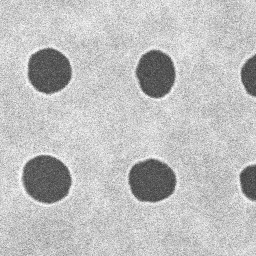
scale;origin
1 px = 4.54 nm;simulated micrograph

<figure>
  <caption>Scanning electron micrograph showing holes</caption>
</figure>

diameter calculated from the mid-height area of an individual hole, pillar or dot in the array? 208 nanometres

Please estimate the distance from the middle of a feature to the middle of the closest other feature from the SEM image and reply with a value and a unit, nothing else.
481 nm